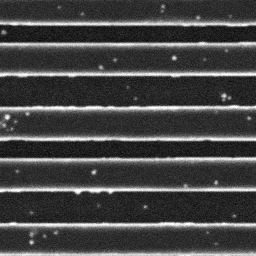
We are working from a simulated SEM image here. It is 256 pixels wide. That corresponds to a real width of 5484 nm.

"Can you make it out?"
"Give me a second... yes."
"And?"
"lines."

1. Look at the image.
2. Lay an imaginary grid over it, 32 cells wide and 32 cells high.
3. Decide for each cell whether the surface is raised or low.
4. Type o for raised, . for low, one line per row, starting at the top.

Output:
oooooooooooooooooooooooooooooooo
oooooooooooooooooooooooooooooooo
oooooooooooooooooooooooooooooooo
................................
................................
oooooooooooooooooooooooooooooooo
oooooooooooooooooooooooooooooooo
oooooooooooooooooooooooooooooooo
oooooooooooooooooooooooooooooooo
................................
................................
................................
................................
oooooooooooooooooooooooooooooooo
oooooooooooooooooooooooooooooooo
oooooooooooooooooooooooooooooooo
oooooooooooooooooooooooooooooooo
................................
................................
................................
oooooooooooooooooooooooooooooooo
oooooooooooooooooooooooooooooooo
oooooooooooooooooooooooooooooooo
oooooooooooooooooooooooooooooooo
................................
................................
................................
................................
oooooooooooooooooooooooooooooooo
oooooooooooooooooooooooooooooooo
oooooooooooooooooooooooooooooooo
oooooooooooooooooooooooooooooooo